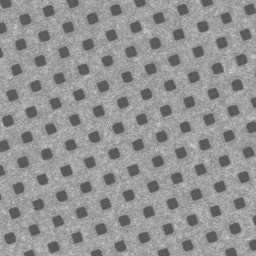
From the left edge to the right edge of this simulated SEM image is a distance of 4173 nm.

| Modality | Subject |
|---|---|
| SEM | a regular array of holes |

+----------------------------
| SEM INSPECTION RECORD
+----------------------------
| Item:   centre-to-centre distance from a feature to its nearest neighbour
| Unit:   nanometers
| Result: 408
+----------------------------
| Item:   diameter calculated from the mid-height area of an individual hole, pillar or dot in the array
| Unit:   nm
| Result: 197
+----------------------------